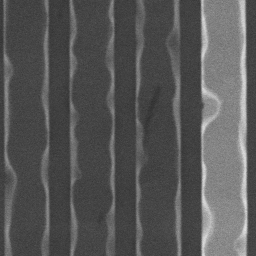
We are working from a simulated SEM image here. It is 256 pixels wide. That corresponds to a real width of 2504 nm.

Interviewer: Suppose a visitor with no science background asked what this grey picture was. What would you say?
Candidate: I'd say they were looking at wiring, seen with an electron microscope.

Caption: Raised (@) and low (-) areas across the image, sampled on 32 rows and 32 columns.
-@@@@@---@@@@@----@@@@---@@@@@--
-@@@@@---@@@@@----@@@@---@@@@@--
-@@@@@---@@@@@----@@@@---@@@@@--
-@@@@@---@@@@@---@@@@@----@@@@@-
-@@@@@---@@@@@---@@@@@----@@@@@-
-@@@@@---@@@@@----@@@@----@@@@@-
-@@@@@---@@@@@---@@@@@---@@@@@@-
-@@@@@---@@@@@---@@@@@---@@@@@--
-@@@@@---@@@@@---@@@@@---@@@@@--
-@@@@@---@@@@@---@@@@@---@@@@@@-
-@@@@@---@@@@@---@@@@@---@@@@@@-
-@@@@@---@@@@@---@@@@@----@@@@@-
-@@@@@---@@@@@---@@@@@----@@@@--
-@@@@@---@@@@@---@@@@@----@@@@--
-@@@@@---@@@@@---@@@@@----@@@@--
-@@@@@---@@@@@---@@@@@----@@@@--
-@@@@@---@@@@@---@@@@@---@@@@@--
-@@@@@---@@@@@---@@@@@---@@@@@--
-@@@@@---@@@@@---@@@@@---@@@@@--
-@@@@@---@@@@@----@@@@@--@@@@@@-
-@@@@@---@@@@@---@@@@@@--@@@@@@-
-@@@@@---@@@@@---@@@@@@---@@@@@-
--@@@@---@@@@@---@@@@@@--@@@@@@-
-@@@@@---@@@@@---@@@@@---@@@@@@-
-@@@@@---@@@@@---@@@@@---@@@@@@-
-@@@@@---@@@@@---@@@@@----@@@@@-
-@@@@@---@@@@@---@@@@@----@@@@@-
-@@@@@---@@@@@---@@@@@----@@@@@-
-@@@@@---@@@@@---@@@@@----@@@@@-
-@@@@@---@@@@@---@@@@@----@@@@@-
-@@@@@---@@@@@---@@@@@---@@@@@--
-@@@@@---@@@@@---@@@@@---@@@@@--